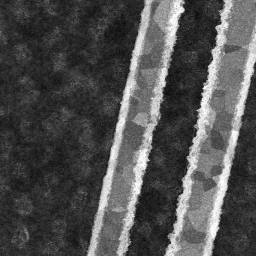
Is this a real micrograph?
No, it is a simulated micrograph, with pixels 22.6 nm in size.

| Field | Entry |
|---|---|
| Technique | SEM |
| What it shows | one or a few lines or trenches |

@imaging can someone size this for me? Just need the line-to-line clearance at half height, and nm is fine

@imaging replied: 1090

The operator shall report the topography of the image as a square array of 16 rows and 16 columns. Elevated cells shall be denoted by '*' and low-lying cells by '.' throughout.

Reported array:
.........**...**
.........**...**
.........**...**
.........*...***
........**...***
........**...**.
........**...**.
........**...**.
.......**...***.
.......**...**..
.......**...**..
.......**...**..
......**...***..
......**...**...
......**...**...
......**...**...